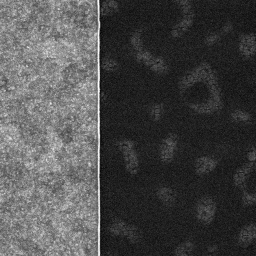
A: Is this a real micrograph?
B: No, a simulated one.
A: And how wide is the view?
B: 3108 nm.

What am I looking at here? one or a few lines or trenches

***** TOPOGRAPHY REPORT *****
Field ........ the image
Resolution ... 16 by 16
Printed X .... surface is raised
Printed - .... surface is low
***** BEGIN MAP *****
XXXXXX----------
XXXXXX----------
XXXXXX----------
XXXXXX----------
XXXXXX----------
XXXXXX----------
XXXXXX----------
XXXXXX----------
XXXXXX----------
XXXXXX----------
XXXXXX----------
XXXXXX----------
XXXXXX----------
XXXXXX----------
XXXXXX----------
XXXXXX----------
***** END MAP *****